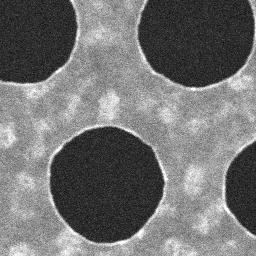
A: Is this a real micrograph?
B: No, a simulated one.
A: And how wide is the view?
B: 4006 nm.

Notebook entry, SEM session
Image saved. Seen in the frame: holes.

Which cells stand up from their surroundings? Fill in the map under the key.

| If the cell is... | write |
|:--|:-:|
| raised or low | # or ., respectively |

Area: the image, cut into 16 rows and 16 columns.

.....####.......
.....####.......
.....####.......
....#####.......
...#######.....#
################
################
################
#####...########
####......#####.
###.......####..
###.......####..
###.......####..
####......#####.
#####....#######
################